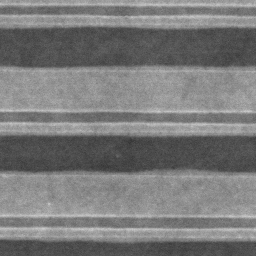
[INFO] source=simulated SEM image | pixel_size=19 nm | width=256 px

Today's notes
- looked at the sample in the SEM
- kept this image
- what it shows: lines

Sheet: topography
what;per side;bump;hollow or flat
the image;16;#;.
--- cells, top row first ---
################
################
................
................
################
################
################
################
................
................
................
################
################
################
################
................